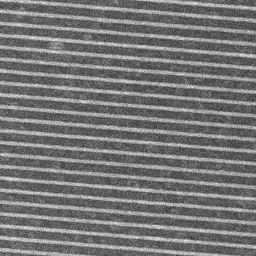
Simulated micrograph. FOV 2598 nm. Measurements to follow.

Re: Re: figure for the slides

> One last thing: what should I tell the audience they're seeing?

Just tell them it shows parallel lines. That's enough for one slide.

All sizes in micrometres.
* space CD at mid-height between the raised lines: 0.0924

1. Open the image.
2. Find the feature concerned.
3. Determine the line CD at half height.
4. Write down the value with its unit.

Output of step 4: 25.3 nm